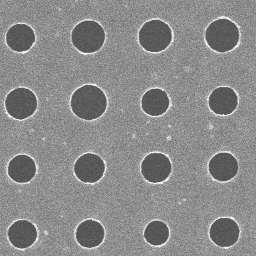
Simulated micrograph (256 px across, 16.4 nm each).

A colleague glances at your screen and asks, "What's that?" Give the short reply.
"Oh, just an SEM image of a regular array of holes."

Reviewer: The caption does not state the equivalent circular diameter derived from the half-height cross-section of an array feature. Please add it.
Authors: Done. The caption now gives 486 nm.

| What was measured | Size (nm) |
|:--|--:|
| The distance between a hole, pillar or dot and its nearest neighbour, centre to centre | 1070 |